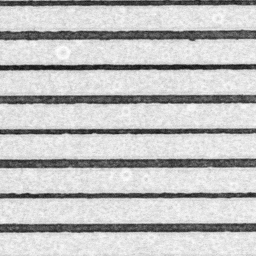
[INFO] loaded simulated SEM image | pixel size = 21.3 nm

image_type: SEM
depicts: parallel lines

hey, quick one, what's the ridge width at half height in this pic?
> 520 nanometers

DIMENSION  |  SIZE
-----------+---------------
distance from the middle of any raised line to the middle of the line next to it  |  32.1 px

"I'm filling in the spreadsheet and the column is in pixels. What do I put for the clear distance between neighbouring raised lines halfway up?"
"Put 9.38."